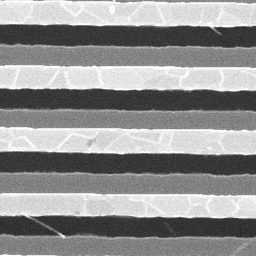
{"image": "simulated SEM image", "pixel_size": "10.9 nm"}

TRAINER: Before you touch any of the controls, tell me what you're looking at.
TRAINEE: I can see lines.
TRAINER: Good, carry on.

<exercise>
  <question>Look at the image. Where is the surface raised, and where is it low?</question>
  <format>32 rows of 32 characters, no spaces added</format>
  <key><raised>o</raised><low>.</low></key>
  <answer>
oooooooooooooooooooooooooooooooo
oooooooooooooooooooooooooooooooo
oooooooooooooooooooooooooooooooo
................................
................................
................................
oooooooooooooooooooooooooooooooo
oooooooooooooooooooooooooooooooo
oooooooooooooooooooooooooooooooo
oooooooooooooooooooooooooooooooo
oooooooooooooooooooooooooooooooo
................................
................................
................................
oooooooooooooooooooooooooooooooo
oooooooooooooooooooooooooooooooo
oooooooooooooooooooooooooooooooo
oooooooooooooooooooooooooooooooo
oooooooooooooooooooooooooooooooo
................................
................................
................................
oooooooooooooooooooooooooooooooo
oooooooooooooooooooooooooooooooo
oooooooooooooooooooooooooooooooo
oooooooooooooooooooooooooooooooo
oooooooooooooooooooooooooooooooo
................................
................................
ooo.oooo.ooo....................
oooooooooooooooooooooooooooooooo
oooooooooooooooooooooooooooooooo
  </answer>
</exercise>